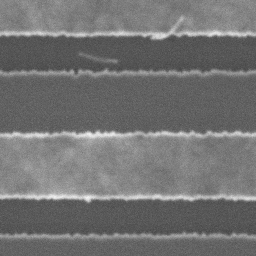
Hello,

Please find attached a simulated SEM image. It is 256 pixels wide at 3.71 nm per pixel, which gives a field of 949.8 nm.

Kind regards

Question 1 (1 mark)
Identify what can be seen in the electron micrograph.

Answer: lines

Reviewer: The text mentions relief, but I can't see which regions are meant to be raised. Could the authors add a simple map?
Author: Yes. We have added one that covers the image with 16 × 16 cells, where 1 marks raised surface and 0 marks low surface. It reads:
1111111111111111
1111111111111111
0000000000000000
0000000000000000
0000000000000000
0000000000000000
0000000000000000
0000000000000000
1111111111111111
1111111111111111
1111111111111111
1111111111111111
0000000000000001
0000000000000000
0000000000000000
0000000000000000